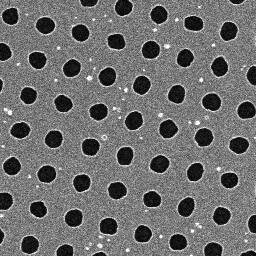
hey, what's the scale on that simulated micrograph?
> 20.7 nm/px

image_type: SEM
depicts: a regular array of holes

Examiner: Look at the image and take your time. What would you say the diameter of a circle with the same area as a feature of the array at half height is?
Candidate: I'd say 17.8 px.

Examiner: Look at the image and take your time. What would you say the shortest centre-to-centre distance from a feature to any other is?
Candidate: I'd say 0.734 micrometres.